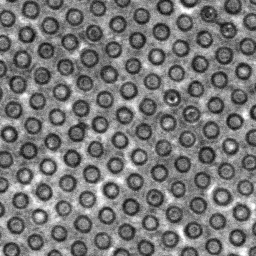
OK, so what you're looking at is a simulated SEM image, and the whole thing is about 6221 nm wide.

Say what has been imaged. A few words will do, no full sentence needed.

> a regular array of ring-shaped raised bodies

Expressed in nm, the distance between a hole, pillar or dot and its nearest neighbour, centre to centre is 610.